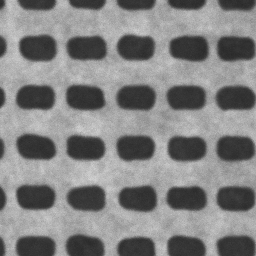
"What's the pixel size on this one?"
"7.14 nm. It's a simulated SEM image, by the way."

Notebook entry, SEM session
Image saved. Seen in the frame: a regular array of holes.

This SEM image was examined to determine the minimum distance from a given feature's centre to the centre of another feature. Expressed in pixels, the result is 49.1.